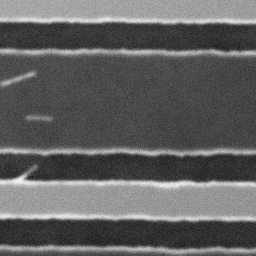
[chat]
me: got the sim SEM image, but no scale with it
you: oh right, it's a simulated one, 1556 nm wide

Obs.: lines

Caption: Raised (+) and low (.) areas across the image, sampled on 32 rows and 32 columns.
++++++++++++++++++++++++++++++++
++++++++++++++++++++++++++++++++
++++++++++++++++++++++++++++++++
................................
................................
................................
+++++++++++++++++++++....++.....
++++++++++++++++++++++++++++++++
++++++++++++++++++++++++++++++++
++++++++++++++++++++++++++++++++
++++++++++++++++++++++++++++++++
++++++++++++++++++++++++++++++++
++++++++++++++++++++++++++++++++
++++++++++++++++++++++++++++++++
++++++++++++++++++++++++++++++++
++++++++++++++++++++++++++++++++
++++++++++++++++++++++++++++++++
++++++++++++++++++++++++++++++++
++++++++++++++++++++++++++++++++
................................
................................
................................
..+.............................
++++++++++++++++++++++++++++++++
++++++++++++++++++++++++++++++++
++++++++++++++++++++++++++++++++
++++++++++++++++++++++++++++++++
.....................+.++...++.+
................................
................................
................................
++++++++++++++++++++++++++++++++